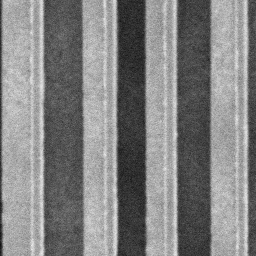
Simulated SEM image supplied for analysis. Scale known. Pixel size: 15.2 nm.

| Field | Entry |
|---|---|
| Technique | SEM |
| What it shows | lines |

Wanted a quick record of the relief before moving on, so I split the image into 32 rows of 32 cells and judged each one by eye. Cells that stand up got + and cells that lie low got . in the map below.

+++++......+++....++++.....++++.
+++++......+++....++++.....++++.
+++++......+++....++++.....++++.
+++++......+++....++++.....++++.
+++++......+++....++++.....++++.
+++++......+++....++++.....++++.
+++++......+++....++++.....++++.
+++++......+++....++++.....++++.
+++++......+++....++++.....++++.
+++++......+++....++++.....++++.
+++++......+++....++++.....++++.
+++++......+++....++++.....++++.
+++++......+++....++++.....++++.
+++++......+++....++++.....++++.
+++++......++++...++++.....++++.
+++++......+++....++++.....++++.
+++++......++++...++++.....++++.
+++++......+++....++++.....++++.
+++++......+++....++++.....++++.
+++++......+++....++++.....++++.
+++++......++++...++++.....++++.
+++++......+++....++++.....++++.
+++++......++++...++++.....++++.
+++++......++++...++++.....++++.
+++++......++++...++++.....++++.
+++++......++++...++++.....++++.
+++++......++++...++++.....++++.
+++++......++++...++++.....++++.
+++++......++++...++++.....++++.
+++++......++++...++++.....++++.
+++++......++++...++++.....++++.
+++++......++++...++++.....++++.